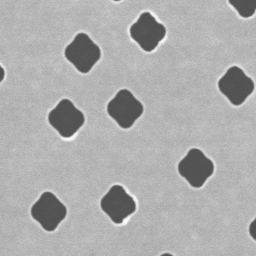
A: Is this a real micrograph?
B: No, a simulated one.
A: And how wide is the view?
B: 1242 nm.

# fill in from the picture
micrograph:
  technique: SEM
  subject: a regular array of holes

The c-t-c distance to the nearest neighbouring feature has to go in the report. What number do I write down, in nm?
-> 334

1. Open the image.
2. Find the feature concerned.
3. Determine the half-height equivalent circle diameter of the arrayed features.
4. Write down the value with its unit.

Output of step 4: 167 nm